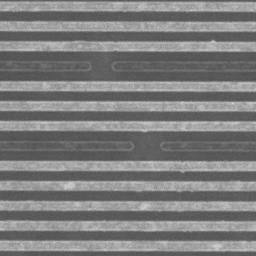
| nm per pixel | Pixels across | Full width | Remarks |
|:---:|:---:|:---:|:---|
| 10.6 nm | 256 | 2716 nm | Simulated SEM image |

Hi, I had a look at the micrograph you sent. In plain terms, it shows parallel lines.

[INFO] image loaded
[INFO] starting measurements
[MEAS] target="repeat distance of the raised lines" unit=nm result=212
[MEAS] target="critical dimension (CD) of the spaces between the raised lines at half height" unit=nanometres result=119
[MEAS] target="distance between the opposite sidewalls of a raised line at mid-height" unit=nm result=91.5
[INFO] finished